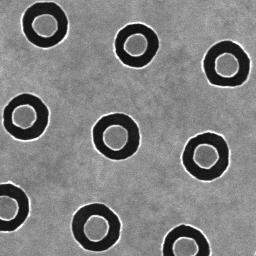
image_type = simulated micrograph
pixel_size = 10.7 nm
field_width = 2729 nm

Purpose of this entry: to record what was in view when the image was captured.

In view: ring-shaped grooves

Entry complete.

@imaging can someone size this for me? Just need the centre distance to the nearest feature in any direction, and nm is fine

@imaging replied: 979